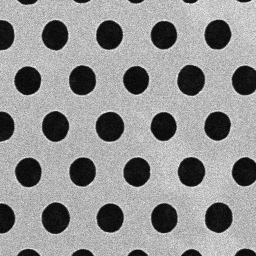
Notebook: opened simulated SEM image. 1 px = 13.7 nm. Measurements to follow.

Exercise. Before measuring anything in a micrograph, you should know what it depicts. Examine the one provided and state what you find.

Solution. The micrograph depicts a regular array of holes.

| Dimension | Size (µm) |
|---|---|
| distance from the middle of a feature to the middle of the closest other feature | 0.723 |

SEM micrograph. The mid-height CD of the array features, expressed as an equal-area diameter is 390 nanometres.